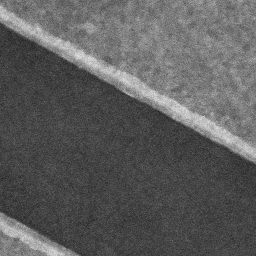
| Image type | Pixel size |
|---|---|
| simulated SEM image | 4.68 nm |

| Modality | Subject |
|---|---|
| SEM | one or a few lines or trenches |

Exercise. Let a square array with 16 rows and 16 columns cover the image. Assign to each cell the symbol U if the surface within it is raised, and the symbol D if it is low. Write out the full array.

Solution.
UUUUUUUUUUUUUUUU
DUUUUUUUUUUUUUUU
DDDUUUUUUUUUUUUU
DDDDDUUUUUUUUUUU
DDDDDDDUUUUUUUUU
DDDDDDDDDUUUUUUU
DDDDDDDDDDDUUUUU
DDDDDDDDDDDDUUUU
DDDDDDDDDDDDDDUU
DDDDDDDDDDDDDDDD
DDDDDDDDDDDDDDDD
DDDDDDDDDDDDDDDD
DDDDDDDDDDDDDDDD
DDDDDDDDDDDDDDDD
UDDDDDDDDDDDDDDD
UUUDDDDDDDDDDDDD